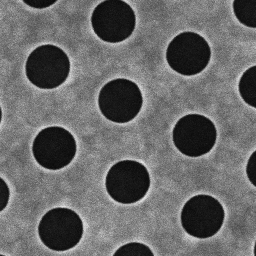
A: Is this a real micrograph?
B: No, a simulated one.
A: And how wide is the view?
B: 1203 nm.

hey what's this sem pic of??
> a regular array of holes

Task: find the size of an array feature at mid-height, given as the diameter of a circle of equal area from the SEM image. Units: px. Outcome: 44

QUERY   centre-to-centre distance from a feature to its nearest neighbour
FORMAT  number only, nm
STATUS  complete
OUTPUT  381